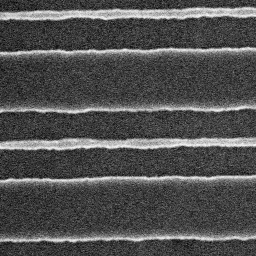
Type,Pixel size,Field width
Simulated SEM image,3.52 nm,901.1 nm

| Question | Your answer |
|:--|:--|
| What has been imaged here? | lines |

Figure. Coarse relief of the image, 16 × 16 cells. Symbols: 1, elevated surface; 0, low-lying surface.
0000000000000000
0000000000000000
0000000000000000
1111111111111111
1111111111111111
1111111111111111
1111111111111111
0000000000000000
0000000000000000
0000000000000000
0000000000000000
1111111111111111
1111111111111111
1111111111111111
1111111111111111
0000000000000000